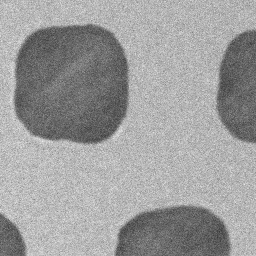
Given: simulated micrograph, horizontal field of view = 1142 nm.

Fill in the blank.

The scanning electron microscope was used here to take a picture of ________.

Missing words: holes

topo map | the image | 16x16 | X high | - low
XXXXXXXXXXXXXXXX
XXXXXXXXXXXXXXXX
XX-----XXXXXXXX-
X-------XXXXXX--
X-------XXXXXX--
X-------XXXXXX--
X-------XXXXXX--
X-------XXXXXX--
XX-----XXXXXXXX-
XXXXXXXXXXXXXXXX
XXXXXXXXXXXXXXXX
XXXXXXXXXXXXXXXX
XXXXXXXXXXXXXXXX
XXXXXXXX------XX
-XXXXXX-------XX
--XXXXX-------XX